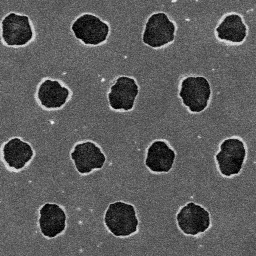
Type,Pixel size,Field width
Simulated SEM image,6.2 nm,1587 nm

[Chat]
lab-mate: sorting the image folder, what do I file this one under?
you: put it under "a regular array of holes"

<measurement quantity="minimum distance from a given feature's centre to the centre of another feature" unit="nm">438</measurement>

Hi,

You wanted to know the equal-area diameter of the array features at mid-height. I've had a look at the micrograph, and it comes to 197 nanometres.